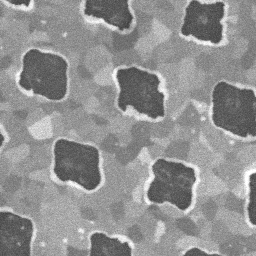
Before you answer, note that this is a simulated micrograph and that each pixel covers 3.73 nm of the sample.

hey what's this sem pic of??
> holes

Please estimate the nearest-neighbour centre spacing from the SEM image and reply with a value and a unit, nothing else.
0.354 um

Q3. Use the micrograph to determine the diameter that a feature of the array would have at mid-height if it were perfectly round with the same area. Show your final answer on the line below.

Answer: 183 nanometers